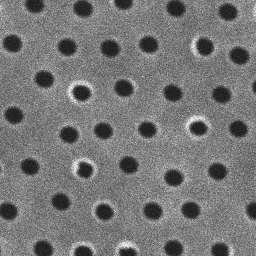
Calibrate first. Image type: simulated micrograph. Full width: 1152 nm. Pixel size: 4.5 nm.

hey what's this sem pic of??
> a regular array of holes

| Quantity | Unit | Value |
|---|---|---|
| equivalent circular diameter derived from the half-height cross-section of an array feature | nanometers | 79.8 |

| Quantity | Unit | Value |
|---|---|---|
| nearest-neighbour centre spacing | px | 39.6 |